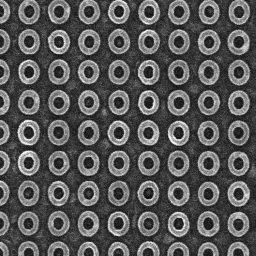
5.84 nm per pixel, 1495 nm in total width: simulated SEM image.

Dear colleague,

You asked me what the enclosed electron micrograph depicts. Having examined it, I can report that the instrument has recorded a regular array of ring-shaped raised bodies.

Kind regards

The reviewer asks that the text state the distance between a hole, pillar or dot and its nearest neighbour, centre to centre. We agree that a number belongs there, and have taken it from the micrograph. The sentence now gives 174 nm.